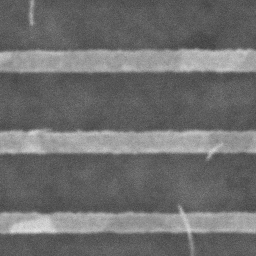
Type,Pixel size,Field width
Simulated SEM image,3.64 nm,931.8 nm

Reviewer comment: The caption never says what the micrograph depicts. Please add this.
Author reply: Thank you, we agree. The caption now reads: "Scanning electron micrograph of lines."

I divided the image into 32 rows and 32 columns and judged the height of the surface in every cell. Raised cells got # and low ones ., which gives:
................................
................................
................................
................................
................................
................................
..####.#########################
################################
################################
................................
................................
................................
................................
................................
................................
................................
.##..........#.....#.#.#####...#
################################
################################
................................
................................
................................
................................
................................
................................
................................
................................
################################
################################
................................
................................
................................